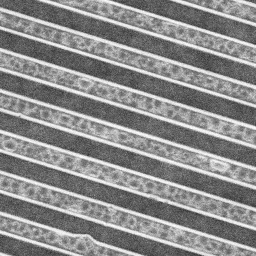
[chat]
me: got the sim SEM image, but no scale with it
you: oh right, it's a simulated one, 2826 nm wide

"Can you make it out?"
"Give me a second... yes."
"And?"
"parallel lines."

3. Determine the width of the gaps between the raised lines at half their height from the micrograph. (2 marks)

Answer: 243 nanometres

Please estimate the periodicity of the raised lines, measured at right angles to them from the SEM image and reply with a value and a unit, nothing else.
431 nm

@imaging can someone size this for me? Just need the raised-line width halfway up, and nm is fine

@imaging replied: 189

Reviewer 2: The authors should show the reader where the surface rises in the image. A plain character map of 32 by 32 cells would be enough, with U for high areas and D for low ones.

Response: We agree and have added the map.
DDDDDDDUUUUUUUDDDDDDDDDDUUUUUUUD
UDDDDDDDDDUUUUUUUUDDDDDDDDDUUUUU
UUUUDDDDDDDDDDUUUUUUUDDDDDDDDDUU
UUUUUUUDDDDDDDDDDUUUUUUUDDDDDDDD
DDDUUUUUUUUDDDDDDDDDUUUUUUUDDDDD
DDDDDDDUUUUUUUDDDDDDDDDUUUUUUUUD
UDDDDDDDDDUUUUUUUDDDDDDDDDDUUUUU
UUUUDDDDDDDDDUUUUUUUUDDDDDDDDDUU
UUUUUUUUDDDDDDDDDUUUUUUUDDDDDDDD
DDDUUUUUUUUDDDDDDDDDUUUUUUUDDDDD
DDDDDDUUUUUUUUDDDDDDDDDUUUUUUUDD
DDDDDDDDDDUUUUUUUDDDDDDDDDUUUUUU
UUUUDDDDDDDDDUUUUUUUUDDDDDDDDDUU
UUUUUUUDDDDDDDDDUUUUUUUUDDDDDDDD
DDDUUUUUUUDDDDDDDDDUUUUUUUUDDDDD
DDDDDDUUUUUUUDDDDDDDDDDUUUUUUUDD
DDDDDDDDDUUUUUUUUDDDDDDDDDUUUUUU
UUUDDDDDDDDDDUUUUUUUDDDDDDDDDUUU
UUUUUUDDDDDDDDDDUUUUUUUDDDDDDDDD
DDDUUUUUUUDDDDDDDDDUUUUUUUDDDDDD
DDDDDDUUUUUUUDDDDDDDDDUUUUUUUUDD
DDDDDDDDDUUUUUUUUDDDDDDDDDUUUUUU
UUUDDDDDDDDDUUUUUUUUDDDDDDDDDUUU
UUUUUUUDDDDDDDDDUUUUUUUDDDDDDDDD
DDUUUUUUUUDDDDDDDDDUUUUUUUDDDDDD
DDDDDUUUUUUUUDDDDDDDDDUUUUUUUDDD
DDDDDDDDDUUUUUUUDDDDDDDDDUUUUUUU
UUUDDDDDDDDDUUUUUUUUDDDDDDDDDUUU
UUUUUUDDDDDDDDDUUUUUUUUDDDDDDDDD
DDUUUUUUUDDDDDDDDDUUUUUUUUDDDDDD
DDDDDUUUUUUUDDDDDDDDDUUUUUUUUDDD
DDDDDDDDUUUUUUUUDDDDDDDDDUUUUUUU